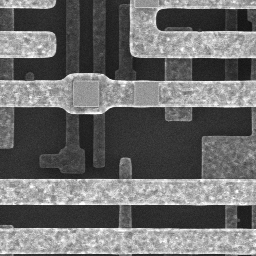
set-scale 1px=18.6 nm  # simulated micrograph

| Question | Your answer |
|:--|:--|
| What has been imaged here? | wiring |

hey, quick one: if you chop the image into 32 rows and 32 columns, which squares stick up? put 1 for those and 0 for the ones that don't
11111110000000001111111111111111
00000000000000001111000000000000
00000000000000001110000000000000
00000000000000001111000000000000
11111110000000001111111111111111
11111110000000001111111111111111
11111110000000001111111111111111
00000000000000000000000000000000
00000000000000000000000000000000
00000000111110000000000000000000
11111111111111111111111111111111
11111111111111111111111111111111
11111111111111111111111111111111
00000000111111000000000000000000
00000000000000000000000000000000
00000000000000000000000000000000
00000000000000000000000000000000
00000000000000000000000000000000
00000000000000000000000000000000
00000000000000000000000000000000
00000000000000000000000000000000
00000000000000000000000000000000
11111111111111111111111111111111
11111111111111111111111111111111
11111111111111111111111111111111
11111111111111111111111111111111
00000000000000000000000000000000
00000000000000000000000000000000
00000000000000000000000000000000
11111111111111111111111111111111
11111111111111111111111111111111
11111111111111111111111111111111